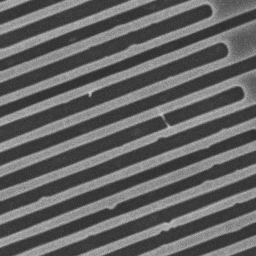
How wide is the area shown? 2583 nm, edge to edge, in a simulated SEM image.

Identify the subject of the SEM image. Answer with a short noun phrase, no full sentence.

parallel lines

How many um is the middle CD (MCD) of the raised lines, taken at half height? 0.0884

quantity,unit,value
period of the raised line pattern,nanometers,223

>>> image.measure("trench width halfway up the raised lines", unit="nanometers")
131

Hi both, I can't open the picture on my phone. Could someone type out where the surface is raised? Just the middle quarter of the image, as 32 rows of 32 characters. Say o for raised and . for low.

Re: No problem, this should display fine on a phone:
....oooooo........oooooo........
..oooooo.......oooooo...........
ooooo........oooooo..........ooo
ooo.......oooooo..........oooooo
.......oooooo...........oooooo..
.....oooooo..........ooooooo....
..oooooo...........oooooo.......
ooooooo.........ooooooo.........
ooo..........ooooooo..........oo
...........oooooo.........oooooo
........ooooooo.........oooooo..
.....ooooooo.........ooooooo....
...oooooo..........oooooo.......
ooooooo.........oooooo..........
oooo.........ooooooo..........oo
oo.........oooooo..........ooooo
........oooooo...........ooooo..
.....ooooooo..........oooooo....
...oooooo...........oooo........
oooooo...........ooooo..........
ooo............ooooo..........oo
o...........ooooo..........ooooo
.........ooooo...........oooooo.
......oooooo..........oooooo....
....oooooo.........oooooo.......
.oooooo..........oooooo........o
ooooo.........oooooo........oooo
oo..........oooooo........oooooo
.........oooooo........oooooooo.
......oooooo.........ooooooo....
....oooooo........ooooooo.......
.oooooo........oooooooo........o